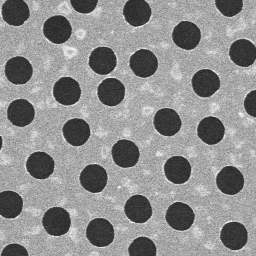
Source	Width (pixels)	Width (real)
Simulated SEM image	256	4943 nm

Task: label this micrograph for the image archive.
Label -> a regular array of holes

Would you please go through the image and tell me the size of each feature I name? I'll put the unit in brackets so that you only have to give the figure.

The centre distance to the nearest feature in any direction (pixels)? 43.4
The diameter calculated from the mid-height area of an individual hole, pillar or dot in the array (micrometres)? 0.547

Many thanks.